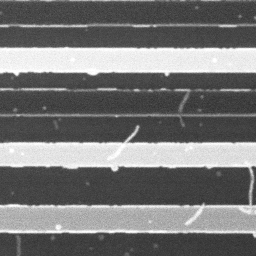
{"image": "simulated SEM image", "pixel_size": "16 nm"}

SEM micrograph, lines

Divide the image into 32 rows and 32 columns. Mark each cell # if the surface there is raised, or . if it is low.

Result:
################################
################################
################################
................................
................................
................................
################################
################################
################################
................................
................................
################################
################################
################################
......................#.........
................................
................................
................................
################################
################################
################################
................................
................................
................................
................................
................................
################################
################################
################################
................................
................................
................................